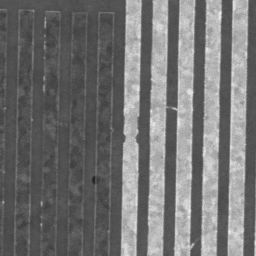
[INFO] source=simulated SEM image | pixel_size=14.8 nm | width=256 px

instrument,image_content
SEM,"parallel lines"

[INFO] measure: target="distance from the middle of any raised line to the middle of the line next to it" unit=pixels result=26.7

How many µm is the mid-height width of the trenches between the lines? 0.186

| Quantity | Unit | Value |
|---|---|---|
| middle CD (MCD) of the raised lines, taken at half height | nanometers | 212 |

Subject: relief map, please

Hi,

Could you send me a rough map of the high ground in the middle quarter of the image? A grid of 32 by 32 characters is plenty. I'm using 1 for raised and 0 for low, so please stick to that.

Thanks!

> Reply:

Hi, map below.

00111000011100011110001110000111
00111000011100011110001110000111
00111000011100011110001110000111
00111000011100011110001110000111
00111000011100011110001110000111
00111000011100011110001110000111
00111000111100011110001110000111
00111000111100011110001110000111
00111000111100011110001110000111
00111000111100011110001110000111
00111000111100011110001110000111
00111000111100011110001110001111
00111000111100011100001110000111
00111000111100011100001110000111
00111000111100011100001110000111
00111000111100011100000010000111
00111000111100011100000110000111
00111000111100011100001110000111
00111000111100001100001110000111
00111000111100011100001110000111
00111000111100011100001110001111
00111000111100011100001110001111
00111000111100011100001110001111
00111000111000011100001110001111
00111000111000011100001110001111
00111000111000011100001110001111
00111000111000011100001110001111
00111000111100011100001110001110
01111000111100011100001110001110
01111000111100010100001110001110
01111000111000011100001110001110
01111000111000011100001110001110